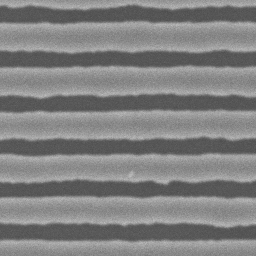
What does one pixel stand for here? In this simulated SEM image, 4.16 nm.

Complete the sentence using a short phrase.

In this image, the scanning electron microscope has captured lines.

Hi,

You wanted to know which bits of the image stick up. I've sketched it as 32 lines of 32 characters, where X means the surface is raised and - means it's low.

XXXXXXXXXXXXXXXXXXXXXXXXXXXXXXXX
--------------------------------
--------------------------------
XXXXXXXXXXXXXXXXXXXXXXXXXXXXXXXX
XXXXXXXXXXXXXXXXXXXXXXXXXXXXXXXX
XXXXXXXXXXXXXXXXXXXXXXXXXXXXXXXX
--------XX----------------------
--------------------------------
--X------XXXXXXXXXX--XXXXXX-X--X
XXXXXXXXXXXXXXXXXXXXXXXXXXXXXXXX
XXXXXXXXXXXXXXXXXXXXXXXXXXXXXXXX
XXXXXXXXXXXXXXXXXXXXXXXXXXXXXXXX
--------------------------------
--------------------------------
XXXXXXXXXXXXXXXXXXXXXXXXXXXXXXXX
XXXXXXXXXXXXXXXXXXXXXXXXXXXXXXXX
XXXXXXXXXXXXXXXXXXXXXXXXXXXXXXXX
--------------------------------
--------------------------------
XXX--XXXXXXXXXXXXXXXXXXXXXXXXXXX
XXXXXXXXXXXXXXXXXXXXXXXXXXXXXXXX
XXXXXXXXXXXXXXXXXXXXXXXXXXXXXXXX
XXXXXXXX----XXXXXX-XXXXXXX---XXX
--------------------------------
--------------------------------
XXXXXXXXXXXXXXXXXXXXXXXXXXXXXXXX
XXXXXXXXXXXXXXXXXXXXXXXXXXXXXXXX
XXXXXXXXXXXXXXXXXXXXXXXXXXXXXXXX
--------------------------------
--------------------------------
XXXXXXXXXXXXXXXXXXXXXXXXXXXXXXXX
XXXXXXXXXXXXXXXXXXXXXXXXXXXXXXXX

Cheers